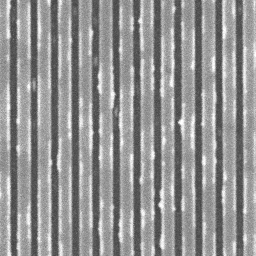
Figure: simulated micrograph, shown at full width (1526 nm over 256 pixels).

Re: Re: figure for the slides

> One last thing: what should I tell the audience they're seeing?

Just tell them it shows parallel lines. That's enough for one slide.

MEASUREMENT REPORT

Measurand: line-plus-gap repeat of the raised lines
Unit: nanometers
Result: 122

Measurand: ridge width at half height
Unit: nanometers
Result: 76.7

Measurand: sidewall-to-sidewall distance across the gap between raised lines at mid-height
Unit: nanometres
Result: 49.2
